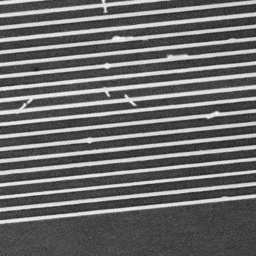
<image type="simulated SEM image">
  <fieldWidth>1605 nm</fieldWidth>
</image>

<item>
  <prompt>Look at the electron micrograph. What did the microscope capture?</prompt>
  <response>parallel lines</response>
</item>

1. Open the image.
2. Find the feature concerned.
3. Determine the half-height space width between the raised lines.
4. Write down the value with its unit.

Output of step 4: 54.6 nm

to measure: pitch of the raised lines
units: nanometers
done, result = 75.5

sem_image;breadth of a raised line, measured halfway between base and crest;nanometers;17.9